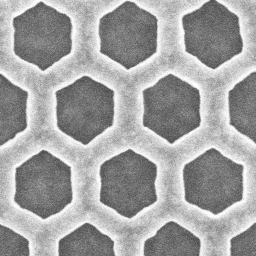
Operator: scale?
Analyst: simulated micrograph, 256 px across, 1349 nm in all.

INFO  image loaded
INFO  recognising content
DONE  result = holes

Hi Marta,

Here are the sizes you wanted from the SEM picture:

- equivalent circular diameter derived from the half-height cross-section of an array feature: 330 nm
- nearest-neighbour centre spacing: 447 nanometers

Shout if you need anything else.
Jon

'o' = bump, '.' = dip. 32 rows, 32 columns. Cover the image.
ooooo.ooooooooo..oooooooo...oooo
ooo.....oooooo.....ooooo.....ooo
oo.......ooo........ooo.......oo
oo.......ooo........ooo.......oo
oo.......ooo........ooo.......oo
oo.......ooo........ooo.......oo
oo.......oooo.......ooo.......oo
ooo....ooooooo....ooooooo....ooo
ooooo.ooooooooo..ooooooooo.ooooo
.oooooooooooooooooooo.ooooooooo.
..ooooooo....oooooo.....oooooo..
...oooo.......oooo.......oooo...
...oooo.......oooo.......ooo....
...oooo.......oooo.......ooo....
...oooo.......oooo.......ooo....
...oooo.......oooo.......oooo...
...ooooo.....oooooo.....oooooo..
.oooooooo...ooooooooo.ooooooooo.
oooooooooooooooooooooooooooooooo
oooo...ooooooo....ooooooo...oooo
ooo.....ooooo.......ooo.......oo
oo.......ooo........ooo.......oo
oo.......oooo......oooo.......oo
oo.......oooo......oooo.......oo
oo.......ooo........ooo.......oo
oo.......oooo......ooooo.....ooo
oooo....ooooooo...oooooooo..oooo
oooooooooooooooooooooooooooooooo
.oooooooo...oooooooo...oooooooo.
...ooooo......ooooo......oooo...
....ooo.......oooo.......oooo...
....ooo.......oooo.......oooo...